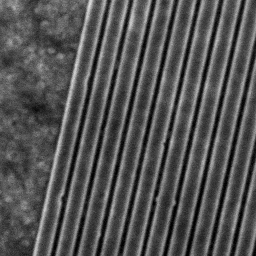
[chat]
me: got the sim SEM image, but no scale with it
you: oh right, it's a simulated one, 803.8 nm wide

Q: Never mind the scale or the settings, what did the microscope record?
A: parallel lines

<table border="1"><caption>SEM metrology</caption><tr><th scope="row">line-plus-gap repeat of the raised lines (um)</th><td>0.0687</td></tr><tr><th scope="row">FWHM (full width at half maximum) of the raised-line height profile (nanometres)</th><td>50.6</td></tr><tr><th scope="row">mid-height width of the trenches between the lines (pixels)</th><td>5.99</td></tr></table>